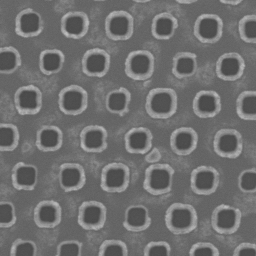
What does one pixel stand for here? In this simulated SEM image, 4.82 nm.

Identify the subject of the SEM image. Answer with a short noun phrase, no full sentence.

a regular array of holes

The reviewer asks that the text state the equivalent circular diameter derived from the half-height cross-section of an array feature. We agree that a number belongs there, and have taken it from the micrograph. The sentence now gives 0.0991 micrometres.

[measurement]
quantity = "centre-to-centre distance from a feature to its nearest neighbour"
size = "211 nanometres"